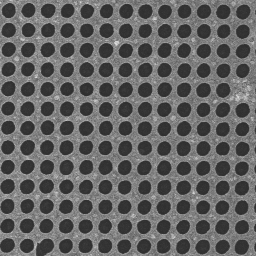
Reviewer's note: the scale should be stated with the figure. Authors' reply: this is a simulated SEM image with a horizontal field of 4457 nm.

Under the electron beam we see a regular array of holes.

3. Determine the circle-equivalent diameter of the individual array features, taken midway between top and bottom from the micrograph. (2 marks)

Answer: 252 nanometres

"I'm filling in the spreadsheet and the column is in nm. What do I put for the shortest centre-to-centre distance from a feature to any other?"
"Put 336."